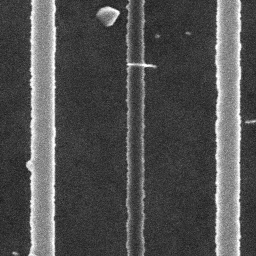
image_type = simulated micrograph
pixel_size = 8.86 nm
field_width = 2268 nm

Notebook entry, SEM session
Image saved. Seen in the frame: lines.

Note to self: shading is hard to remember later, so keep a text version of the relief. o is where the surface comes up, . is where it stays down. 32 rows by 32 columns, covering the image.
....ooo.........oo.........ooo..
....ooo.....ooo.oo.........ooo..
....ooo......o..oo.........ooo..
....ooo.........oo.........ooo..
....ooo.........oo.........ooo..
....ooo.........oo.........ooo..
....ooo.........oo.........ooo..
....ooo.........oo.........ooo..
....ooo.........oo.........ooo..
....ooo.........oo.........ooo..
....ooo.........oo.........ooo..
....ooo.........oo.........ooo..
....ooo.........oo.........ooo..
....ooo.........oo.........ooo..
....ooo.........oo.........ooo..
....ooo.........oo.........ooo..
....ooo.........oo.........ooo..
....ooo.........oo.........ooo..
....ooo.........oo.........ooo..
....ooo.........oo.........ooo..
...oooo.........oo.........ooo..
....ooo.........oo.........ooo..
....ooo.........oo.........ooo..
....ooo.........oo.........ooo..
....ooo.........oo.........ooo..
....ooo.........oo.........ooo..
....ooo.........oo.........ooo..
....ooo.........oo.........ooo..
....ooo.........oo.........ooo..
....ooo.........oo.........ooo..
....ooo.........oo.........ooo..
....ooo.........oo.........ooo..